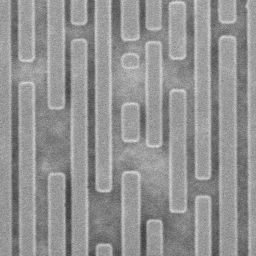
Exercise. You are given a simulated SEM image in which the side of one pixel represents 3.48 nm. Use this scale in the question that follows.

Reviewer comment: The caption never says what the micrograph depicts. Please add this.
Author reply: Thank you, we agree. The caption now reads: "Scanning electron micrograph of parallel lines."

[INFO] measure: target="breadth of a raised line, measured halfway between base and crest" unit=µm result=0.0539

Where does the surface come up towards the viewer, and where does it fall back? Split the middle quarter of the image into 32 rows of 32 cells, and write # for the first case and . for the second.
..####..####...####..###........
..####..####.........###........
..####..####.........###........
..####..####.........###........
..####..####.........###........
..####..####.........###........
..####..####.........###........
..####..####.........###..####..
..####..####.........###..####..
..####..####.........###..####..
..####..####...####..###..####..
..####..####...####..###..####..
..####..####...####..###...###..
..####..####...####..###...###..
..####..####...####..###..####..
..####..####...####..###...###..
..####..####...####..###...###..
..####..####...####..###..####..
..####..####...####..###...###..
..####..####.........###..####..
..####..####.........###..####..
..####..####..............####..
..####..####..............####..
..####..####..............####..
..####..####..............####..
..####..####..............####..
..####..####...............###..
..####..####...####.......####..
..####..####...####.......####..
..####..####...####........###..
..####..####...####........###..
..####..###....####........###..